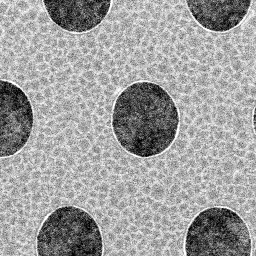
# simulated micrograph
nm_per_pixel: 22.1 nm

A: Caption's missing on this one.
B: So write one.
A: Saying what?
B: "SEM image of holes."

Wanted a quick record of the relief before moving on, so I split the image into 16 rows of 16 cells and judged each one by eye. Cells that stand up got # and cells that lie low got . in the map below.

###....#####....
####..######...#
################
################
################
.#######..######
..#####....#####
..#####....#####
..#####....#####
.#######..######
################
################
################
###...######...#
##....######....
##....######....